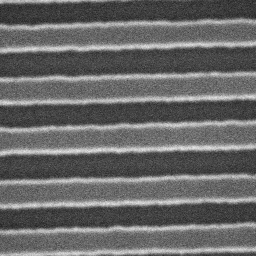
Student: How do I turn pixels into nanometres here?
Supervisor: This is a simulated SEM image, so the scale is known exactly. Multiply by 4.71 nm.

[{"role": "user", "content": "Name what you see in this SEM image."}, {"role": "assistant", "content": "lines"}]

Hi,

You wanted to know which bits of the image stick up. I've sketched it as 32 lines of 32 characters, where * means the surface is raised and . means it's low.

................................
................................
................................
********************************
********************************
********************************
*...............................
................................
................................
..................*.************
********************************
********************************
************************........
................................
................................
......................**********
********************************
********************************
********************************
................................
................................
................................
.........*...*******************
********************************
********************************
*******************.............
................................
................................
..............*.*...************
********************************
********************************
*************************.......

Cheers